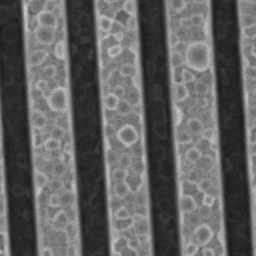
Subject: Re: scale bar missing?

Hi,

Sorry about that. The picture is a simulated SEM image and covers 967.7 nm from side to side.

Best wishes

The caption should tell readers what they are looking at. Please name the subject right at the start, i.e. one or a few lines or trenches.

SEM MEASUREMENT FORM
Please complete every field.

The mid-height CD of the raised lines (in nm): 168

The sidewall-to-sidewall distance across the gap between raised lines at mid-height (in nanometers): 102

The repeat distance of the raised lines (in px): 72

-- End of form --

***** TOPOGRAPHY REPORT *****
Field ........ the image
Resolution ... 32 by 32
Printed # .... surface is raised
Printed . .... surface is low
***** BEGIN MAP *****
...#####....#####....#####....##
...#####....#####....#####....##
...#####....#####....#####....##
...#####....#####....######...##
...#####....#####....######...##
...#####....#####....######...##
...######...######...######...##
...######...######...######...##
...######...######...######...##
...######...######...######...##
...######...######...######...##
...######...######...######...##
...######....#####...######...##
....#####....#####...######....#
....#####....#####....#####....#
....#####....#####...######....#
....#####....#####....#####....#
....#####....#####....#####....#
....#####....#####....######...#
....#####....#####....######...#
#...#####....#####....######...#
#...######...#####....######...#
#...######...######...######...#
#...######...######...######...#
#...######...######...######...#
#...######...######...######...#
#...######...######...######...#
#...######....#####...######...#
#....#####....#####...######...#
#....#####....#####...######...#
#....#####....#####....#####....
#....#####....#####....#####....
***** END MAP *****